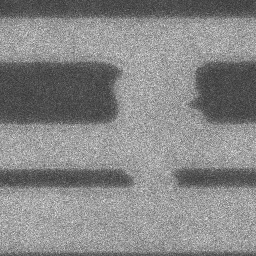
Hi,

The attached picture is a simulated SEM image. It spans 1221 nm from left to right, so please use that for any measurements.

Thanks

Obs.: one or a few lines or trenches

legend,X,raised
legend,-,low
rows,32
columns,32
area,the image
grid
XXXXXXXXXXXXXXXXXXXXXXXXXXXXXXXX
XXXXXXXXXXXXXXXXXXXXXXXXXXXXXXXX
--------------------------------
--------------------------------
--------------------------------
--------------------------------
--------------------------------
---------------------------XXXXX
XXXXXXXXXXXXXXX---------XXXXXXXX
XXXXXXXXXXXXXXX---------XXXXXXXX
XXXXXXXXXXXXXXX---------XXXXXXXX
XXXXXXXXXXXXXX----------XXXXXXXX
XXXXXXXXXXXXXXX---------XXXXXXXX
XXXXXXXXXXXXXXX--------XXXXXXXXX
XXXXXXXXXXXXXXX----------XXXXXXX
XXXXXXXXXXXXXX------------XXXXXX
--------------------------------
--------------------------------
--------------------------------
--------------------------------
--------------------------------
XXXXXXXXXXXXXXXX-----XXXXXXXXXXX
XXXXXXXXXXXXXXXXX-----XXXXXXXXXX
XXXXXXXXXXXXXXXXX-----XXXXXXXXXX
--------------------------------
--------------------------------
--------------------------------
--------------------------------
--------------------------------
--------------------------------
--------------------------------
XXXXXXXXXXXXXXXXXXXXXXXXXXXXXXXX